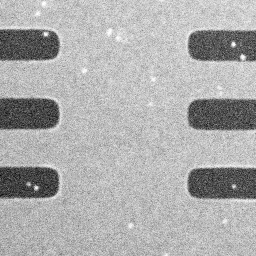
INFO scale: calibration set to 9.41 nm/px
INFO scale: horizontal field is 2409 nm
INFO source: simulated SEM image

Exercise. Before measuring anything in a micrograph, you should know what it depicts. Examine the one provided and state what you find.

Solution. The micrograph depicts groups of lines, slits or small figures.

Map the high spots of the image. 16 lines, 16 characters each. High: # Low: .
################
################
....########....
....########....
################
################
....########....
....########....
################
################
...#########....
....########....
##############..
################
################
################